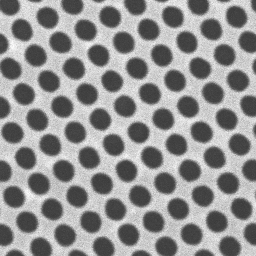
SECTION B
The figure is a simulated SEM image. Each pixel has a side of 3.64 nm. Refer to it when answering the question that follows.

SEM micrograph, a regular array of holes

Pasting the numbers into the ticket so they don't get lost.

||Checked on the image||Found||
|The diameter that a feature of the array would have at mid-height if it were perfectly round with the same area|77.3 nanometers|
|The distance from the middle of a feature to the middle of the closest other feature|102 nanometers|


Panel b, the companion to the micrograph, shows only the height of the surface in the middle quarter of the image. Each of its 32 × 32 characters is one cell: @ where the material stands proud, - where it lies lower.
-----@@@@-@@@@@------@@@--@@@@@-
-----@@@@@@@@@@@-----@@@@@@-@@@-
-----@@@@@----@@-----@@@@@----@@
@@--@@@@@-----@@@---@@@@@-----@@
@@@@@@@@@------@@@@@@@@@@-----@@
@@@@---@@@-----@@@@----@@@----@@
@@@-----@@@---@@@@@-----@@@--@@@
@@@-----@@@@@@@@@@@-----@@@@@@@@
-@@-----@@@@@@---@@-----@@@@@---
--@@----@@@@@-----@@---@@@@@@---
--@@@@@@@@@@@-----@@@@@@@@@@----
--@@@@@@--@@@-----@@@@@---@@@---
--@@@@@----@@@---@@@@@-----@@---
@@@@@@------@@@@@@@@@@-----@@@@@
@@-@@@@-----@@@@@@@@@@-----@@@@@
@----@@----@@@@@-----@@----@@@@@
-----@@@@-@@@@@@-----@@@@@@@@@@@
------@@@@@@@@@@-----@@@@@@@@@@@
@----@@@@@----@@@----@@@@@----@@
@@--@@@@@@-----@@@--@@@@@@-----@
@@@@@@@@@@-----@@@@@@@@@@@-----@
@@@@----@@-----@@@@@----@@-----@
@@@@-----@@---@@@@@-----@@@---@@
@@@@-----@@@@@@@@@@------@@@@@@@
-@@@-----@@@@@---@@@-----@@@@@--
--@@@---@@@@@-----@@@---@@@@@---
--@@@@@@@@@@@-----@@@@@@@@@@@---
---@@@@@--@@@-----@@@@@@---@@---
--@@@@@-----@@----@@@@@-----@@--
-@@@@@@-----@@@@@@@@@@@-----@@@@
@@@@@@@-----@@@@@@-@@@@-----@@@@
@----@@@----@@@@@----@@-----@@@@